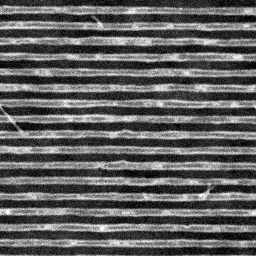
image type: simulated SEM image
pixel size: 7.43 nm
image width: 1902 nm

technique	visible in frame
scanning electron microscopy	parallel lines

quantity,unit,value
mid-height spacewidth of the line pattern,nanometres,71.5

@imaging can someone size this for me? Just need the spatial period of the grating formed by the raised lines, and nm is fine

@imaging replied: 115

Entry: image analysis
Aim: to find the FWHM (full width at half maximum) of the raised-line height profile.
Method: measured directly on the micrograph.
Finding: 45.5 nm